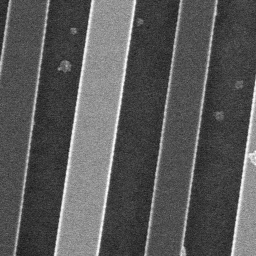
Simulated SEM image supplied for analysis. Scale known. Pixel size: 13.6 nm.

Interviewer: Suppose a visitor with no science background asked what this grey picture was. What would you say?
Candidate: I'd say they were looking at lines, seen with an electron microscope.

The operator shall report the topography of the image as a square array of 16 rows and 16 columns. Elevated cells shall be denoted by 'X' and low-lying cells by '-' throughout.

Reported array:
-XX---XX---XXX--
XXX---XX---XX---
XXX--XXX---XX---
XXX--XXX---XX---
XX---XXX---XX---
XX---XXX--XXX---
XX---XXX--XXX---
XX---XX---XXX---
XX--XXX---XX---X
XX--XXX---XX---X
XX--XXX---XX---X
XX--XXX---XX---X
X---XXX---XX---X
X---XX---XXX---X
X---XX---XXX---X
X--XXX---XX----X